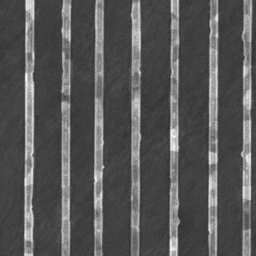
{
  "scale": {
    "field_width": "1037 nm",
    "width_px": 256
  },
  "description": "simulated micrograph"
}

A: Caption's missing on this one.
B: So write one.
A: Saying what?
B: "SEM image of parallel lines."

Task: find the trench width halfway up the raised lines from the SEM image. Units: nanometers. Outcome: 120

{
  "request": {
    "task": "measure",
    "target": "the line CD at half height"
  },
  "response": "28.8 nm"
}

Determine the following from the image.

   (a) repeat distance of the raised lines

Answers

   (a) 147 nanometers